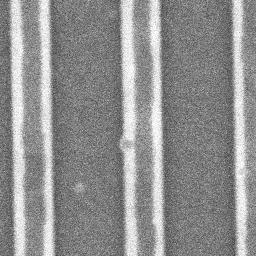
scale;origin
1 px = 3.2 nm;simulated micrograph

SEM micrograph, one or a few lines or trenches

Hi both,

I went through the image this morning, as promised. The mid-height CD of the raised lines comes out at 96.2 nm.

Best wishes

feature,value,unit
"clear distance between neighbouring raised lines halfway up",80.7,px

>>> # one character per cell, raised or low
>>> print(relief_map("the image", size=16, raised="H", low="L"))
LHHLLLLLHHLLLLLH
LHHLLLLLHHLLLLLH
LHHLLLLLHHLLLLLH
LHHLLLLLHHLLLLLH
LHHLLLLLHHLLLLLH
LHHLLLLLHHLLLLLH
LHHLLLLLHHLLLLLH
LHHLLLLLHHLLLLLH
LHHLLLLLHHLLLLLH
LHHLLLLLHHLLLLLH
LHHLLLLLHHLLLLLH
LHHLLLLLHHLLLLLH
LHHLLLLLHHLLLLLH
LHHLLLLLHHLLLLLH
LHHLLLLLHHLLLLLH
LHHLLLLLHHLLLLLH